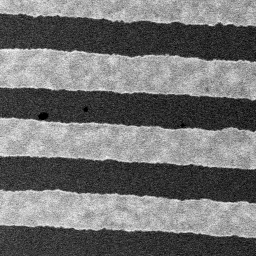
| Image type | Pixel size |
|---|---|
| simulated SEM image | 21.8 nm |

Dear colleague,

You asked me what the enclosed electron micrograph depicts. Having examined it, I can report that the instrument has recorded one or a few lines or trenches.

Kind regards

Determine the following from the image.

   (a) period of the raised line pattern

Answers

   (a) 1520 nanometers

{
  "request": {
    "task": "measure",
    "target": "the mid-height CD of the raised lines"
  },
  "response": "35.5 pixels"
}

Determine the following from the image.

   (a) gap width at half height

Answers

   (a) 34.6 px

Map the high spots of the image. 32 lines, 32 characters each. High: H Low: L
HHHHHLLHHHHHHHHHHHHHHHHHHHHHHHHH
HHHHHHHLHHHHHHHHHHHHHHHHHHHHHHHH
LLLLLLLLLLLLLLHHHHHHHHHHHHHHHHHH
LLLLLLLLLLLLLLLLLLLLLLLLLLLLLLLL
LLLLLLLLLLLLLLLLLLLLLLLLLLLLLLLL
LLLLLLLLLLLLLLLLLLLLLLLLLLLLLLLL
HLHHHHHHLHLLLLLLLLLLLLLLLLLLLLLL
HLHHHHHHHHHHHHHHHHHHHHHHHLLLLLLL
HHHHHHHHHHHHHHHHHHHHHHHHHHLHHHHH
HHHHHHHHHHHHHHHHHHHHHHHHHHHHHHHH
HHHHHHHHHHHHHHHHHHHHHHHHHHHHHHHH
LLLLLLLLLLLLLLLHHLHHHHHHHHHHHHHH
LLLLLLLLLLLLLLLLLLLLLLLLLLLLLLLL
LLLLLLLLLLLLLLLLLLLLLLLLLLLLLLLL
LLLLLLLLLLLLLLLLLLLLLLLLLLLLLLLL
HHHHHHHLHHHHLLLLLLLLLLLLLLLLLLLL
HHHHHHHHHHHHHHHHHHHHHHHHHHHHHHHH
HHHHHHHHHHHHHHHHHHHHHHHHHHHHHHHH
HHHHHHHHHHHHHHHHHHHHHHHHHHHHHHHH
LLLLHHHHHHHHHLHHHHHHHHHHHHHHHHHH
LLLLLLLLLLLLLLLLLLLLLLLLHHHHHHHH
LLLLLLLLLLLLLLLLLLLLLLLLLLLLLLLL
LLLLLLLLLLLLLLLLLLLLLLLLLLLLLLLL
LLLLLLLLLLLLLLLLLLLLLLLLLLLLLLLL
HHHHHHHHHHHHHHHHHLLLLLLLLLLLLLLL
HHHHHHHHHHHHHHHHHHHHHLHHHHHHHHHL
HHHHHHHHHLHHHHHHHHHHHHHHHHHHHHHH
HHHHHHHHHHHHHHHHHHHHHHHHHHHHHHHH
LLLLLLLLLHHHHHHHHHHHHHHHHHHHHHHH
LLLLLLLLLLLLLLLLLLLLLLLLLLLLLLHH
LLLLLLLLLLLLLLLLLLLLLLLLLLLLLLLL
LLLLLLLLLLLLLLLLLLLLLLLLLLLLLLLL